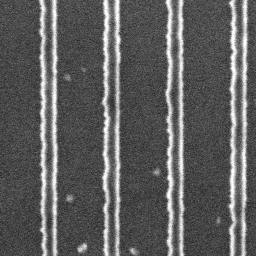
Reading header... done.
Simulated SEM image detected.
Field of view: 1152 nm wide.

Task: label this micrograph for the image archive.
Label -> lines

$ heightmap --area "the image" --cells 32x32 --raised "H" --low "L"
LLLLLHHLLLLLLHHLLLLLLHHLLLLLLHHL
LLLLLHHLLLLLLHHLLLLLLHHLLLLLLHHL
LLLLLHHLLLLLLHHLLLLLLHHLLLLLLHHL
LLLLLHHLLLLLLHHLLLLLLHHLLLLLLHHL
LLLLLHHLLLLLLHHLLLLLLHHLLLLLLHHL
LLLLLHHLLLLLLHHLLLLLLHHLLLLLLHHL
LLLLLHHLLLLLLHHLLLLLLHHLLLLLLHHL
LLLLLHHLLLLLLHHLLLLLLHHLLLLLLHHL
LLLLLHHLLLLLLHHLLLLLLHHLLLLLLHHL
LLLLLHHLLLLLLHHLLLLLLHHLLLLLLHHL
LLLLLHHLLLLLLHHLLLLLLHHLLLLLLHHL
LLLLLHHLLLLLLHHLLLLLLHHLLLLLLHHL
LLLLLHHLLLLLLHHLLLLLLHHLLLLLLHHL
LLLLLHHLLLLLLHHLLLLLLHHLLLLLLHHL
LLLLLHHLLLLLLHHLLLLLLHHLLLLLLHHL
LLLLLHHLLLLLLHHLLLLLLHHLLLLLLHHL
LLLLLHHLLLLLLHHLLLLLLHHLLLLLLHHL
LLLLLHHLLLLLLHHLLLLLLHHLLLLLLHHL
LLLLLHHLLLLLLHHLLLLLLHHLLLLLLHHL
LLLLLHHLLLLLLHHLLLLLLHHLLLLLLHHL
LLLLLHHLLLLLLHHLLLLLLHHLLLLLLHHL
LLLLLHHLLLLLLHHLLLLLLHHLLLLLLHHL
LLLLLHHLLLLLLHHLLLLLLHHLLLLLLHHL
LLLLLHHLLLLLLHHLLLLLLHHLLLLLLHHL
LLLLLHHLLLLLLHHLLLLLLHHLLLLLLHHL
LLLLLHHLLLLLLHHLLLLLLHHLLLLLLHHL
LLLLLHHLLLLLLHHLLLLLLHHLLLLLLHLL
LLLLLHHLLLLLLHHLLLLLLHHLLLLLLHLL
LLLLLHHLLLLLLHHLLLLLLHHLLLLLLHHL
LLLLLHHLLLLLLHHLLLLLLHHLLLLLLHHL
LLLLLHHLLLLLLHHLLLLLLHHLLLLLLHLL
LLLLLLHLLLLLLHHLLLLLLHHLLLLLLHLL